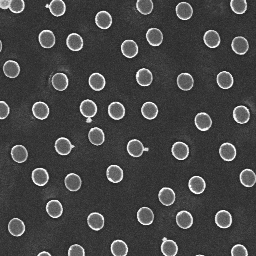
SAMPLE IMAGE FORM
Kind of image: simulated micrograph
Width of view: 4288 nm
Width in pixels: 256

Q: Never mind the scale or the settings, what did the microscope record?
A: a regular array of raised bodies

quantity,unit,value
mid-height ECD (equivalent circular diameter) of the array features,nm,284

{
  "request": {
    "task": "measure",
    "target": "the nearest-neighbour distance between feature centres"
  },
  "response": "32.3 px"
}